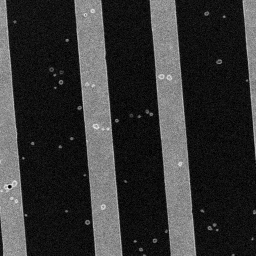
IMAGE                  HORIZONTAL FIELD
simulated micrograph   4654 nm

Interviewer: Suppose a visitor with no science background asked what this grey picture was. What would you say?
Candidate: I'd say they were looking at one or a few lines or trenches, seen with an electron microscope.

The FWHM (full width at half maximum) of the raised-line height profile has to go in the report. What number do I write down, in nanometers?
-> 448